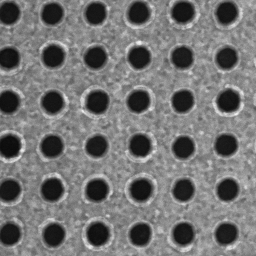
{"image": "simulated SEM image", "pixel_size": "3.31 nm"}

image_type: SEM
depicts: a regular array of holes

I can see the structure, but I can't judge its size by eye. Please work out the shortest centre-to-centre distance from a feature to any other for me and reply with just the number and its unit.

42.9 pixels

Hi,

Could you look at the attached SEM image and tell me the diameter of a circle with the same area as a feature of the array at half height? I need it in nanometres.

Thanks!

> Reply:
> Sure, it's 80.2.